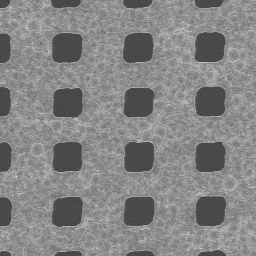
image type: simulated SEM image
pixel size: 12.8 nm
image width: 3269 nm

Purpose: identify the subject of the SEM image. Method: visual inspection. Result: a regular array of holes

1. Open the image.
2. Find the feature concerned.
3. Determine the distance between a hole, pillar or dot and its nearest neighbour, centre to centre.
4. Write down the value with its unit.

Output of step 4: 694 nm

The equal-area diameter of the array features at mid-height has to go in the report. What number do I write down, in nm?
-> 412